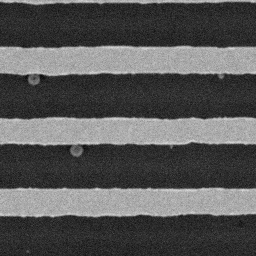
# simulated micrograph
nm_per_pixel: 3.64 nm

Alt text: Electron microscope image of lines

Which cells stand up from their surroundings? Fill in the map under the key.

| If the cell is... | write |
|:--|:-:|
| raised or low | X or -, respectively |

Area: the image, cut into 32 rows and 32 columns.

----XX--------------------------
--------------------------------
--------------------------------
--------------------------------
--------------------------------
--------------------------------
XXXXXXXXXXXXXXXXXXXXXXXXXXXXXXXX
XXXXXXXXXXXXXXXXXXXXXXXXXXXXXXXX
XXXXXXXXXXXXXXXXXXXXXXXXXXXXXXXX
--------------------------------
--------------------------------
--------------------------------
--------------------------------
--------------------------------
--------------------------------
XXXXXXXXXXXXXXXXXXXXXXXXXXXXXXXX
XXXXXXXXXXXXXXXXXXXXXXXXXXXXXXXX
XXXXXXXXXXXXXXXXXXXXXXXXXXXXXXXX
--------------------------------
--------------------------------
--------------------------------
--------------------------------
--------------------------------
--------------------------------
XXXXXXXXXXXXXXXXXXXXXXXXXXXXXXXX
XXXXXXXXXXXXXXXXXXXXXXXXXXXXXXXX
XXXXXXXXXXXXXXXXXXXXXXXXXXXXXXXX
--------------------------------
--------------------------------
--------------------------------
--------------------------------
--------------------------------